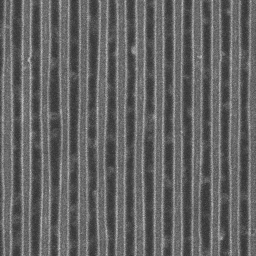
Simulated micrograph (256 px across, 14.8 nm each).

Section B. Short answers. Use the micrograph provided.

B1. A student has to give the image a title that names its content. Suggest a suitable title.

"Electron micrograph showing parallel lines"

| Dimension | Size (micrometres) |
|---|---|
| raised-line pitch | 0.281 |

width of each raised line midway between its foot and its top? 11.6 px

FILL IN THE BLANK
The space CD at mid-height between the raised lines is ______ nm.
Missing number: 106